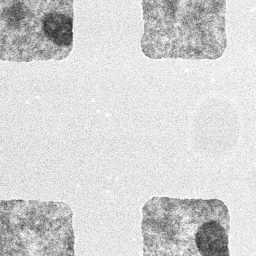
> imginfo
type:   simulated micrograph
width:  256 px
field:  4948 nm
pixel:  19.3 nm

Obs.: holes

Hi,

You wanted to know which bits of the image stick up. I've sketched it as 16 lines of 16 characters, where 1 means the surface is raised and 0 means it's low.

0000011110000011
0000011110000011
0000011110000011
0000111110000011
1111111111111111
1111111111111111
1111111111111111
1111111111111111
1111111111111111
1111111111111111
1111111111111111
1111111111111111
0011111110000011
0000011110000011
0000011110000011
0000011110000011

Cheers